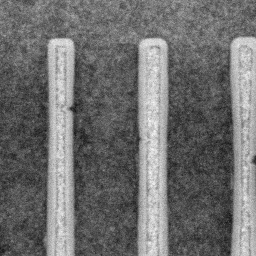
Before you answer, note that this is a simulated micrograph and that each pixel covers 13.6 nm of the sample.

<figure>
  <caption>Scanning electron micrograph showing one or a few lines or trenches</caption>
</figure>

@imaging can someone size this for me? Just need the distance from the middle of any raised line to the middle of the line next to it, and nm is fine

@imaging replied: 1260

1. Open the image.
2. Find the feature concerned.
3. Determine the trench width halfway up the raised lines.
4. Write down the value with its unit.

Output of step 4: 986 nm